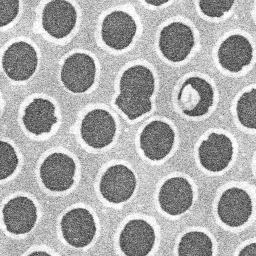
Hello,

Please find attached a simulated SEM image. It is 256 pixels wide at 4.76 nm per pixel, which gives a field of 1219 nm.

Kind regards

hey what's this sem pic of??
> a regular array of holes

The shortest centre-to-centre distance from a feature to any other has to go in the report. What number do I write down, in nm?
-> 276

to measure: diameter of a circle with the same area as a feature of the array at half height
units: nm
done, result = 180